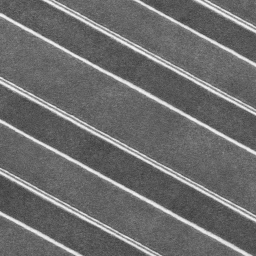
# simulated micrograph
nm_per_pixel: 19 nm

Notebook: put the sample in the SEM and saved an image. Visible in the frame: lines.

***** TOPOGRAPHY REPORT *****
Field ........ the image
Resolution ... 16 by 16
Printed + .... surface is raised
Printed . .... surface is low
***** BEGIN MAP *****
....+++++....+++
+.....+++++....+
+++....++++++...
+++++....++++++.
+++++++....+++++
.+++++++.....+++
...+++++++.....+
....++++++++....
++....++++++++..
++++....++++++++
+++++.....++++++
.++++++.....++++
...++++++.....++
.....++++++....+
++.....++++++...
++++.....++++++.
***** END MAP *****